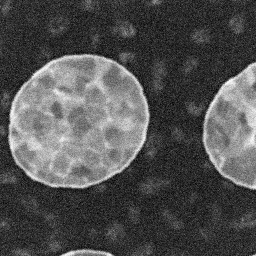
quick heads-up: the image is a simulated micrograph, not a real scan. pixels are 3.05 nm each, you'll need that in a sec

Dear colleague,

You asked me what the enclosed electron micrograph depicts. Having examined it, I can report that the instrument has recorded raised bodies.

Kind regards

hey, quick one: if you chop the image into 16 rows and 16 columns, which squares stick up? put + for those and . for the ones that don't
................
................
................
....++..........
..++++++.......+
.++++++++.....++
.++++++++....+++
.++++++++....+++
.++++++++....+++
.++++++++....+++
.+++++++......++
...+++.........+
................
................
................
................